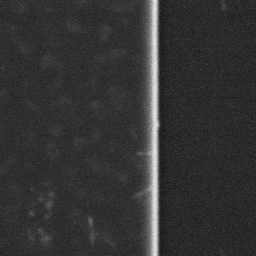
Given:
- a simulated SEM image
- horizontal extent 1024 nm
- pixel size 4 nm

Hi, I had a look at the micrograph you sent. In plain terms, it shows one or a few lines or trenches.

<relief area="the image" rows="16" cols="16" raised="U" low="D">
UUUUUUUUUUDDDDDD
UUUUUUUUUUDDDDDD
UUUUUUUUUUDDDDDD
UUUUUUUUUUDDDDDD
UUUUUUUUUUDDDDDD
UUUUUUUUUUDDDDDD
UUUUUUUUUUDDDDDD
UUUUUUUUUUDDDDDD
UUUUUUUUUUDDDDDD
UUUUUUUUUUDDDDDD
UUUUUUUUUUDDDDDD
UUUUUUUUUUDDDDDD
UUUUUUUUUUDDDDDD
UUUUUUUUUUDDDDDD
UUUUUUUUUUDDDDDD
UUUUUUUUUUDDDDDD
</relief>